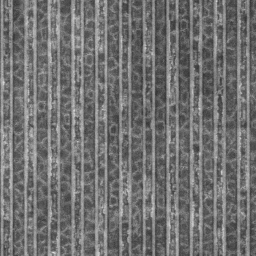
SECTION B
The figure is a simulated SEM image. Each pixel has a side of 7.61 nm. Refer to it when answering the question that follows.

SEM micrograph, parallel lines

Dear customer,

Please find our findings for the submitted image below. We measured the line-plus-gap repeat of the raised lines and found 180 nm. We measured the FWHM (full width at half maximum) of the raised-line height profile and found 73.2 nanometres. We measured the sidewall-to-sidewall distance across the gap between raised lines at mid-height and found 13.9 pixels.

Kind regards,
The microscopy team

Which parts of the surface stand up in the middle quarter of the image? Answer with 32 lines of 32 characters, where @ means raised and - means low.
--@@----@@----@@----@@----@@----
--@@----@@----@@----@@----@@----
--@@----@@----@@----@@----@@----
--@@----@@----@@----@@----@@----
--@@----@@----@@----@@----@@----
--@@----@@----@@----@@----@@----
--@@----@@----@@----@@----@@----
--@@----@@----@@----@@----@@----
--@@----@@----@@----@@----@@----
--@@----@@----@@----@@----@@----
--@@----@@----@@----@@----@@----
--@@----@@----@@----@@----@@----
--@@----@@----@@----@@----@@----
--@@----@@----@@----@@----@@----
--@@----@@----@@----@@----@@----
--@@----@@----@@----@@----@@----
--@@----@@----@@----@@----@@----
--@@----@@----@@----@@----@@----
--@@----@@@---@@----@@----@@----
--@@----@@@---@@----@@----@@----
--@@----@@@---@@----@@----@@----
--@@----@@@---@@----@@----@@----
--@@@---@@@---@@----@@----@@----
--@@@---@@@---@@----@@----@@----
--@@----@@@---@@----@@----@@----
--@@----@@@---@@----@@----@@----
--@@----@@@---@@----@@----@@----
--@@----@@@---@@----@@----@@----
--@@----@@@---@@----@@----@@----
--@@----@@@---@@----@@----@@----
--@@----@@@---@@----@@----@@----
--@@----@@@---@@----@@----@@----